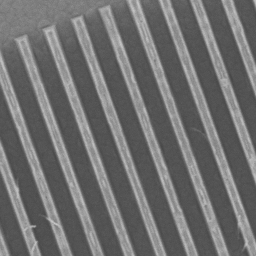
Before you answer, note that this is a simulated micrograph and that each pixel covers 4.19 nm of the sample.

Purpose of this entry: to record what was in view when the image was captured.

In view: parallel lines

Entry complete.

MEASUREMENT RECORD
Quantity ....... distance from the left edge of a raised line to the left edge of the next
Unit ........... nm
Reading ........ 124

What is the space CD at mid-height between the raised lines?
75.9 nanometres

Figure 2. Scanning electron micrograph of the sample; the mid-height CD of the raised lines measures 0.0468 microns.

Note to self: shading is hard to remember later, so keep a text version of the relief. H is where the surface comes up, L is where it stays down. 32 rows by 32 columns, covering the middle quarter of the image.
HLLLLLHHHLLLLLHHHLLLLLHHHLLLLHHH
HLLLLLHHHLLLLLHHHLLLLLHHHLLLLLHH
HHLLLLLHHHLLLLLHHHLLLLHHHLLLLLHH
HHLLLLLHHHLLLLLHHHLLLLLHHHLLLLLH
HHLLLLLHHHLLLLLHHHLLLLLHHHLLLLLH
HHHLLLLLHHHLLLLLHHHLLLLHHHLLLLLH
HHHLLLLLHHHLLLLLHHHLLLLLHHHLLLLL
LHHLLLLLHHHHLLLLHHHLLLLLHHHLLLLL
LHHHLLLLLHHHLLLLLHHHLLLLLHHLLLLL
LHHHLLLLLHHHLLLLLHHHLLLLLHHHLLLL
LLHHHLLLLHHHHLLLLHHHLLLLLHHHLLLL
LLHHHLLLLLHHHLLLLLHHHLLLLLHHHLLL
LLHHHLLLLLHHHLLLLLHHHLLLLLHHHLLL
LLLHHHLLLLHHHHLLLLHHHLLLLLHHHLLL
LLLHHHLLLLLHHHLLLLLHHHLLLLLHHHLL
LLLHHHLLLLLHHHLLLLLHHHLLLLLHHHLL
LLLLHHHLLLLLHHHLLLLLHHLLLLLHHHLL
LLLLHHHLLLLLHHHLLLLLHHHLLLLLHHHL
LLLLHHHLLLLLHHHLLLLLHHHLLLLLHHHL
LLLLLHHHLLLLLHHHLLLLLHHHLLLLHHHL
LLLLLHHHLLLLLHHHLLLLLHHHLLLLLHHH
HLLLLLHHLLLLLLHHHLLLLHHHLLLLLHHH
HLLLLLHHHLLLLLHHHLLLLLHHHLLLLHHH
HLLLLLHHHLLLLLHHHLLLLLHHHLLLLLHH
HHLLLLLHHHLLLLLHHLLLLLHHHLLLLLHH
HHLLLLLHHHLLLLLHHHLLLLLHHHLLLLLH
HHLLLLLHHHLLLLLHHHLLLLLHHHLLLLLH
HHHLLLLLHHHLLLLLHHLLLLLHHHLLLLLH
HHHLLLLLHHHLLLLLHHHLLLLLHHHLLLLL
LHHHLLLLHHHLLLLLHHHLLLLLHHHLLLLL
LHHHLLLLLHHHLLLLLHHLLLLLLHHHLLLL
LHHHLLLLLHHHLLLLLHHHLLLLLHHHLLLL